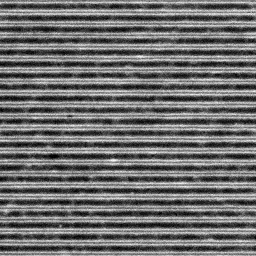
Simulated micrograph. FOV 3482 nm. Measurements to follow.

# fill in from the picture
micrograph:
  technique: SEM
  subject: parallel lines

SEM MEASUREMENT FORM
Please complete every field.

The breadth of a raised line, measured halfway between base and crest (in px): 8.88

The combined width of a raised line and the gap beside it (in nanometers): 157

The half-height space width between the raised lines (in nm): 37.4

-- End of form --